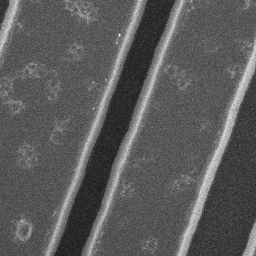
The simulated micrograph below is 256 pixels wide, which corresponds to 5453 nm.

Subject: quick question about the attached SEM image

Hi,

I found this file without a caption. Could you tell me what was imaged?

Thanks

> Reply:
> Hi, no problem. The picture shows one or a few lines or trenches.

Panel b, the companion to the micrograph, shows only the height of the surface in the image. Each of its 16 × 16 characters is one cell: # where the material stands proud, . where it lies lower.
.########..#####
########...#####
########..######
########..######
#######...######
#######..######.
#######..######.
######..######..
######..######..
#####...######..
#####..######...
#####..######...
####...######...
####..######....
####..######....
###..#######....